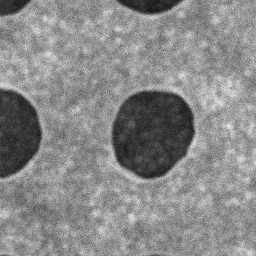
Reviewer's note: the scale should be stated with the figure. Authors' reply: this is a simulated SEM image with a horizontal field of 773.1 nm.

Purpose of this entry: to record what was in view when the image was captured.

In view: holes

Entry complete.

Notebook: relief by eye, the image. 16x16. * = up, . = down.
.*******...*****
****************
****************
****************
****************
****************
..******....****
..*****.....****
...****.....****
..*****.....****
.*******...*****
****************
****************
****************
****************
****************